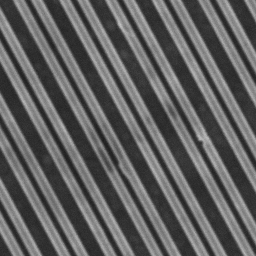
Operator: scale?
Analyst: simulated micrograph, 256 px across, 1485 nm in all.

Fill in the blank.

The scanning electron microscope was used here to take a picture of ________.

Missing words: parallel lines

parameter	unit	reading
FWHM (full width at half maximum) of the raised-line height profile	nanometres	51.6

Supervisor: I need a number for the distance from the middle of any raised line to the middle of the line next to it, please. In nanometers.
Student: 117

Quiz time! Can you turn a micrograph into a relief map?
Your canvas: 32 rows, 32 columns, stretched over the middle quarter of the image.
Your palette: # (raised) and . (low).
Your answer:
.##.....##...##.....##..##.....#
.###....###..##.....##...##.....
..##.....##...##.....##..##.....
#.###.....##..##.....##...##....
#..##.....###..##.....##..###...
##..##.....##..##.....###..##...
##..###....###..##.....##..###..
###..##.....##..##.....###..##..
.##..###....###..##.....##..###.
.###..##.....##..###.....##..##.
..##..###....###..##.....##..###
..###..##.....##..###.....##..##
...##..###....###..##.....##..##
....##..##.....##...##.....##..#
....###.###.....##..##.....##...
.....##..##.....###..##.....##..
.....###.###.....##..##.....###.
#.....##..##.....###..##.....##.
##....###..##.....##..##.....###
##.....##..###....###..##.....##
###....###..##.....##..###....##
.##.....##..###....###..##.....#
.###....###..##.....##..###.....
..##.....##..###....###..##.....
..###....###..##.....##...##....
#..##.....##..###....###..##....
#..###.....##.###.....##...##...
##..##.....###.###.....##..##...
##...##.....##..##.....###..##..
###..###....###..##.....##..##..
.##...##.....##..###....###..##.
..##..###....###..##.....##..###